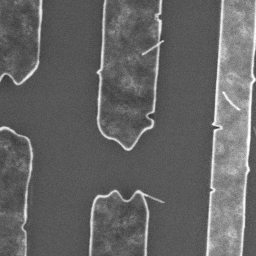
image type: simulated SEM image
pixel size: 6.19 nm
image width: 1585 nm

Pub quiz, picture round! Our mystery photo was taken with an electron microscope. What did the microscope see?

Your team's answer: one or a few lines or trenches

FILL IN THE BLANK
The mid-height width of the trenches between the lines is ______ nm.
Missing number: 389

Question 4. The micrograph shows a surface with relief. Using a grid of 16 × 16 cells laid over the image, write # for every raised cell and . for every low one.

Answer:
###....###....##
###...####....##
##....####....##
##....####....##
##....####....##
......####....##
......####...###
......###....###
#......##....###
##...........###
##...........##.
##...........##.
##....###....##.
##....###....##.
##....###....##.
##....###....##.